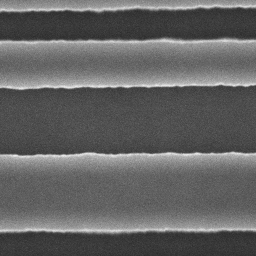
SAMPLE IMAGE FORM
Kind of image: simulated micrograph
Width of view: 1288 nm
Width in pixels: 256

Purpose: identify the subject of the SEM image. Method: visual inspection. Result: lines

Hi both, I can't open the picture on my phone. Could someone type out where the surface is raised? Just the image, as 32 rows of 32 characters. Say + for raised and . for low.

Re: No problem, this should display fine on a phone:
++++++++++++++++++++++++++++++++
................................
................................
................................
................................
++++++++++++++++++++++++++++++++
++++++++++++++++++++++++++++++++
++++++++++++++++++++++++++++++++
++++++++++++++++++++++++++++++++
++++++++++++++++++++++++++++++++
++++++++++++++++++++++++++++++++
................................
................................
................................
................................
................................
................................
................................
................................
++..++++++++++++++++++++++++++++
++++++++++++++++++++++++++++++++
++++++++++++++++++++++++++++++++
++++++++++++++++++++++++++++++++
++++++++++++++++++++++++++++++++
++++++++++++++++++++++++++++++++
++++++++++++++++++++++++++++++++
++++++++++++++++++++++++++++++++
++++++++++++++++++++++++++++++++
++++++++++++++++++++++++++++++++
................................
................................
................................